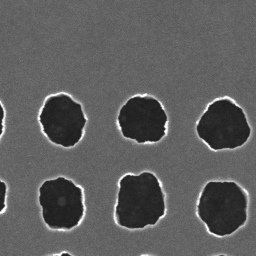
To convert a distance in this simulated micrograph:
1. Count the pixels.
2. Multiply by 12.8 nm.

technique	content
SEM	holes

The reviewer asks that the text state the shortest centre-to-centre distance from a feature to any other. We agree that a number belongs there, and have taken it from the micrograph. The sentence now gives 1020 nanometers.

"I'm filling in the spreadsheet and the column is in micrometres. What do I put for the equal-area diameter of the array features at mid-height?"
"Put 0.622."